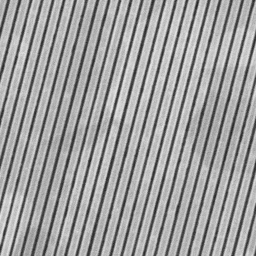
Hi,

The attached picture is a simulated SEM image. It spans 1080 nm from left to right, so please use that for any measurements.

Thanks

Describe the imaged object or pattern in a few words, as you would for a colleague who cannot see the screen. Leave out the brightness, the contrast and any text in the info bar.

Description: parallel lines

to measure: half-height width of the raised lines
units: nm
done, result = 30.1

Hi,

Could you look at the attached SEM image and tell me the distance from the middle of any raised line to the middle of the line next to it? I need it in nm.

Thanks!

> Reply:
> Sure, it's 45.5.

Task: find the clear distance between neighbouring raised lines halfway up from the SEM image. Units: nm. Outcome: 15.4